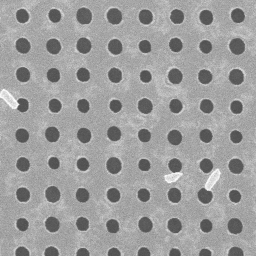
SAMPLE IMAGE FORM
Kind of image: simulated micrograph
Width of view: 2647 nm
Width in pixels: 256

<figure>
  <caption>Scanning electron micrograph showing a regular array of holes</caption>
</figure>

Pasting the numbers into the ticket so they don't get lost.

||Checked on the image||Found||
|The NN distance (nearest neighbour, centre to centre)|0.303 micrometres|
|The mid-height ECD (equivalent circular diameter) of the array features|147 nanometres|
